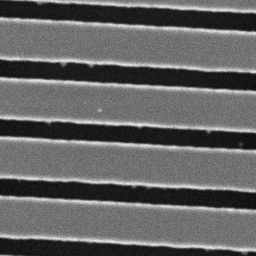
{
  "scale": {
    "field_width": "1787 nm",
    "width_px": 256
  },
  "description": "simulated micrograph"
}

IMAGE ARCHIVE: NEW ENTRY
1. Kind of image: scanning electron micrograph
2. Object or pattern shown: lines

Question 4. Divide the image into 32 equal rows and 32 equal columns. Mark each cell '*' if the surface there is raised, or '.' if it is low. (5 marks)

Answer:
...........*********************
..............................**
*****...........................
***********************.........
********************************
********************************
********************************
...*****************************
......................**********
................................
***************.................
********************************
********************************
********************************
********************************
.............*******************
...............................*
*******.........................
*************************.......
********************************
********************************
********************************
.....***************************
.......................*********
................................
******************..............
********************************
********************************
********************************
********************************
.................***************
................................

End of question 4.